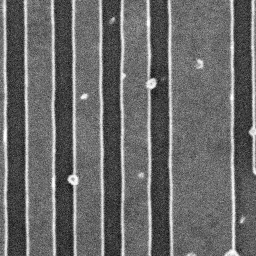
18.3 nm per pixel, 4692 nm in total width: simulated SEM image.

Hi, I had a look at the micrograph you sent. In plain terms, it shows groups of lines, slits or small figures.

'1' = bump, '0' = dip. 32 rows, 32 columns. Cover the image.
10011110011110011100011111111000
10011110011110011100011111111000
10011110011110011100011111111000
10011110011110011100011111111000
10011110011110011110011111111000
10011110011110011110011111111000
10011110011110011110011111111000
10011110011110011110011111111000
10011110011110011110011111111000
10011110011110011110011111111000
10011110011110011110011111111000
10011110011110011110011111111000
10011110011110011110011111111000
10011110011110011110011111111000
10011110011110011110011111111000
10011110011110011110011111111000
10011110011110011110011111111001
10011110011110011110011111111000
10011110011110011110011111111000
10011110011110011110011111111000
10011110011110011110011111111000
10011110011110011110011111111000
10011110011110011110011111111000
10011110011110011110011111111000
10011110011110011110011111111000
10011110011110011110011111111000
10011110011110011110011111111000
10011110011110011110011111111000
10011110011110011110011111111000
10011110011110011110011111111000
10011110011110011110011111111000
10011110011110011110011111111000